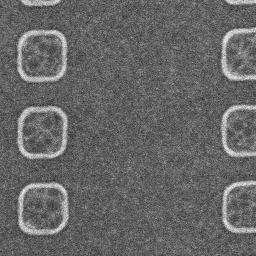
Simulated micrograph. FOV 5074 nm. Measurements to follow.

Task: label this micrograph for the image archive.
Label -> raised bodies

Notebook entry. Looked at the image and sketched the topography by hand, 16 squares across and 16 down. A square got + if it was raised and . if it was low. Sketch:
................
................
.+++..........++
.+++..........++
.+++..........++
................
................
.+++..........++
.+++..........++
..++...........+
................
...............+
.+++..........++
.+++..........++
................
................